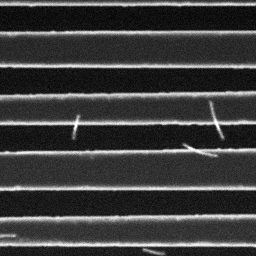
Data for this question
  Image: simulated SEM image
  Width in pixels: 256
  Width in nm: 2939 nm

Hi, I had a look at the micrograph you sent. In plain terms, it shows lines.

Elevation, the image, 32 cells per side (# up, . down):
#.##################.#######.###
................................
................................
................................
################################
################################
################################
################################
................................
................................
................................
................................
################################
################################
################################
.........#................##....
................................
................................
................................
################################
################################
################################
################################
################################
................................
................................
................................
################################
################################
################################
################################
................................